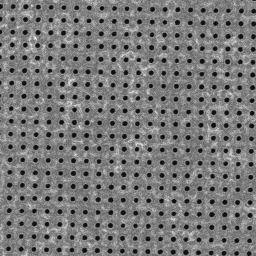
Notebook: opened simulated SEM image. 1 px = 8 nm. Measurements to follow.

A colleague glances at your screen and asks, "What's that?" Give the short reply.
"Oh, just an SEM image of a regular array of holes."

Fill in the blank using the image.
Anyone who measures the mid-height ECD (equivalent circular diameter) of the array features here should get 5.05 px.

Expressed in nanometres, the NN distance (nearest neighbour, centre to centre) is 99.8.